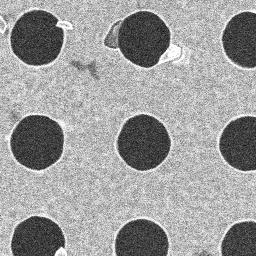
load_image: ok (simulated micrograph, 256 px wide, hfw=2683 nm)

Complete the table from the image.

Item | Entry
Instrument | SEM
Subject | holes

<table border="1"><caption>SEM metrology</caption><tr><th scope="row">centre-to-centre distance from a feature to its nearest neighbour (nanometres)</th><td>1090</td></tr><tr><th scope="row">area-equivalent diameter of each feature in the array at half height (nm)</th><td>572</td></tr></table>